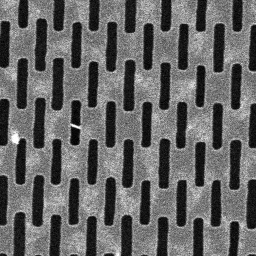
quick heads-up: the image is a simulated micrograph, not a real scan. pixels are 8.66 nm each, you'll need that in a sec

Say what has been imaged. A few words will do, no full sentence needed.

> a regular array of holes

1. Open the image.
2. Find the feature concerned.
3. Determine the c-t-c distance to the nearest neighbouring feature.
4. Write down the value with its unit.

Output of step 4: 307 nm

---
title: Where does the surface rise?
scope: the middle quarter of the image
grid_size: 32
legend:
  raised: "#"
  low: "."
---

##..##...#...##...##..##...#...#
######...##..##...##..##...##.##
######...######...######...#####
######...######...######...#####
######...######...######...#####
######..#######...######...#####
######..#######...######..######
######..#######...######...#####
######..#######...######..######
##..##..###..##...######..###.##
##..##..###..##...#...##..##...#
##..######...##..##...##..##...#
##..######...######...######...#
##..######...######...######...#
##..######...######...######...#
##..######...######...######...#
##..######...######...######...#
##..######...######...######...#
##..######...######...######...#
#...##..##...##..##...##...#...#
##.###...#...##...#..###...#..##
######...######...######...#####
######...######...######...#####
######...######..#######..######
######...######..#######..######
######...######..#######...#####
######..#######..#######..######
######..#######..######...######
##.###..###..#...######...######
#...##..##...#...###..#...##...#
#...######...##..##...##..##...#
#...######...######...######...#